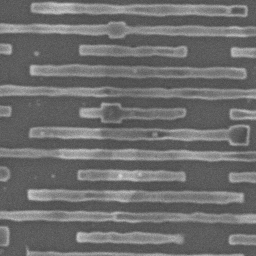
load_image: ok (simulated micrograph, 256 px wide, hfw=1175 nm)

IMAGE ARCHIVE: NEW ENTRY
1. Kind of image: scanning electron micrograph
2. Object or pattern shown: wiring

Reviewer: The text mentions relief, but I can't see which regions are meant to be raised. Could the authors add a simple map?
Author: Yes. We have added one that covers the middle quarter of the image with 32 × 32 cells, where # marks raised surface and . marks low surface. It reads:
######..........................
################################
#############################.##
................................
................................
................................
################################
##########.#####################
................................
................................
.........##..#..................
....################.#########..
....##########################..
.........########.##########....
..........####..................
................................
#####################........###
####################..#....#####
##......#############.##..######
................................
................................
######.####....###..............
################################
################################
................................
................................
................................
....##########################..
....##########################..
................................
................................
................................